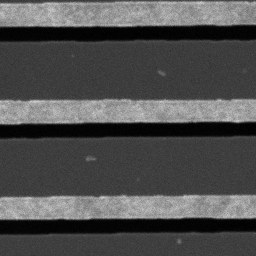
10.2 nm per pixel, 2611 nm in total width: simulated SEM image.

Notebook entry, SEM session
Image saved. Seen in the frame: lines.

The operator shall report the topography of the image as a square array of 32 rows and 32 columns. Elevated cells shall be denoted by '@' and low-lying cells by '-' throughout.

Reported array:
@@@@@@@@@@@@@@@@@@@@@@@@@@@@@@@@
@@@@@@@@@@@@@@@@@@@@@@@@@@@@@@@@
@@@@@@@@@@@@@@@@@@@@@@@@@@@@@@@@
--------------------------------
--------------------------------
@@@@@@@@@@@@@@@@@@@@@@@@@@@@@@@@
@@@@@@@@@@@@@@@@@@@@@@@@@@@@@@@@
@@@@@@@@@@@@@@@@@@@@@@@@@@@@@@@@
@@@@@@@@@@@@@@@@@@@@@@@@@@@@@@@@
@@@@@@@@@@@@@@@@@@@@@@@@@@@@@@@@
@@@@@@@@@@@@@@@@@@@@@@@@@@@@@@@@
@@@@@@@@@@@@@@@@@@@@@@@@@@@@@@@@
@@@@@@@@@@@@@@@@@@@@@@@@@@@@@@@@
@@@@@@@@@@@@@@@@@@@@@@@@@@@@@@@@
@@@@@@@@@@@@@@@@@@@@@@@@@@@@@@@@
--------------------------------
--------------------------------
@@@@@@@@@@@@@@@@@@@@@@@@@@@@@@@@
@@@@@@@@@@@@@@@@@@@@@@@@@@@@@@@@
@@@@@@@@@@@@@@@@@@@@@@@@@@@@@@@@
@@@@@@@@@@@@@@@@@@@@@@@@@@@@@@@@
@@@@@@@@@@@@@@@@@@@@@@@@@@@@@@@@
@@@@@@@@@@@@@@@@@@@@@@@@@@@@@@@@
@@@@@@@@@@@@@@@@@@@@@@@@@@@@@@@@
@@@@@@@@@@@@@@@@@@@@@@@@@@@@@@@@
@@@@@@@@@@@@@@@@@@@@@@@@@@@@@@@@
@@@@@@@@@@@@@@@@@@@@@@@@@@@@@@@@
--------------------------------
--------------------------------
@@@@@@@@@@@@@@@@@@@@@@@@@@@@@@@@
@@@@@@@@@@@@@@@@@@@@@@@@@@@@@@@@
@@@@@@@@@@@@@@@@@@@@@@@@@@@@@@@@